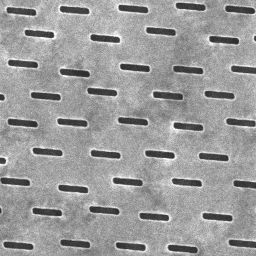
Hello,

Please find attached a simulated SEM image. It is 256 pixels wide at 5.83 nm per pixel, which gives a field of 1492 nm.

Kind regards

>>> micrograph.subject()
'a regular array of holes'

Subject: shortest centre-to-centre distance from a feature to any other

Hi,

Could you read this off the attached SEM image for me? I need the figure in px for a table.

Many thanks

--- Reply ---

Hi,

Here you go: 36.8